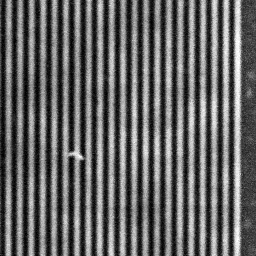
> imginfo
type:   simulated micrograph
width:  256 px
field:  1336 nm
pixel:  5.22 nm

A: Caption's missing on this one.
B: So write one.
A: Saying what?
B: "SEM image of parallel lines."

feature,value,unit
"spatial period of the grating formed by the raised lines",59.6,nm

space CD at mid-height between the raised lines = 33.9 nanometres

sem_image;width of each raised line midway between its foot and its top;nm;24.1